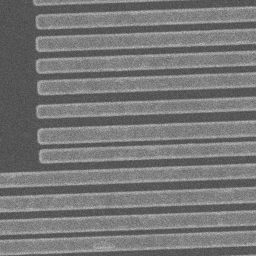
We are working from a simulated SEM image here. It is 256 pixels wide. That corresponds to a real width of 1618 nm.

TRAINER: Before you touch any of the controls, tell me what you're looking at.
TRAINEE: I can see parallel lines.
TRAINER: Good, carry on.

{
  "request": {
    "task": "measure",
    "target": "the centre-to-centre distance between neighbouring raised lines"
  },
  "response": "142 nm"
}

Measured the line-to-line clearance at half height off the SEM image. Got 57.7 nm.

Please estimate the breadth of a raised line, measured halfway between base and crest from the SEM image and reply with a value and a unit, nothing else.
84.5 nm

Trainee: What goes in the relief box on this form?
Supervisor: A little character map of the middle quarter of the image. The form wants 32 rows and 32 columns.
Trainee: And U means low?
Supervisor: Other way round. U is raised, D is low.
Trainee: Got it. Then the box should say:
UUUUUUUUUUUUUUUUUUUUUUUUUUUUUUUU
UUUUUUUUUUDDDDDDDDDDDDDDDDDDDDDD
DDDDDDDDDDDDDDDDDDDDDDDDDDDDDDDD
DDDDDDDDDDDDDDDDDDUUUUUUUUUUUUUU
UUUUUUUUUUUUUUUUUUUUUUUUUUUUUUUU
UUUUUUUUUUUUUUUUUUUUUUUUUUUUUUUU
UUUUUUUUUUUUUUUUUUUUUUDDDDDDDDDD
DDDDDDDDDDDDDDDDDDDDDDDDDDDDDDDD
DDDDDDDDDDDDDDDDDDDDDDDDDDDDDDDD
DDDDDDDDDDDDDDDDDDDDUUUUUUUUUUUU
UUUUUUUUUUUUUUUUUUUUUUUUUUUUUUUU
UUUUUUUUUUUUUUUUUUUUUUUUUUUUUUUU
UUUUUUUUUUUUUUUUUUDDDDDDDDDDDDDD
DDDDDDDDDDDDDDDDDDDDDDDDDDDDDDDD
DDDDDDDDDDDDDDDDDDDDDDDDDDDDDDDD
DDDDDDDDDDDDDDDDDUUUUUUUUUUUUUUU
UUUUUUUUUUUUUUUUUUUUUUUUUUUUUUUU
UUUUUUUUUUUUUUUUUUUUUUUUUUUUUUUU
UUUUUUUUUUUUUUUUUUUUUUUUUUUUUUUD
UUUUDDDDDDDDDDDDDDDDDDDDDDDDDDDD
DDDDDDDDDDDDDDDDDDDDDDDDDDDDUUUU
DUUUUUUUUUUUUUUUUUUUUUUUUUUUUUUU
UUUUUUUUUUUUUUUUUUUUUUUUUUUUUUUU
UUUUUUUUUUUUUUUUUUUUDDDDDDDDDDDD
DDDDDDDDDDDDDDDDDDDDDDDDDDDDDDDD
DDDDDDDDDDDDDDDDDDDDDDDDDDDDDDDD
DDDDDDDDDDDDDUUUUUUUUUUUUUUUUUUU
UUUUUUUUUUUUUUUUUUUUUUUUUUUUUUUU
UUUUUUUUUUUUUUUUUUUUUUUUUUUUUUUU
UUUUUUUUUUUUUUUUUDDDDDDDDDDDDDDD
DDDDDDDDDDDDDDDDDDDDDDDDDDDDDDDD
DDDDDDDDDDDDDDDDDDDDDDDDDDDDDDDD